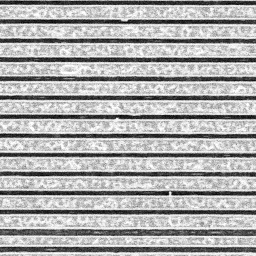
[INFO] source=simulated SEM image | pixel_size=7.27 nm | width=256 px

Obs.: parallel lines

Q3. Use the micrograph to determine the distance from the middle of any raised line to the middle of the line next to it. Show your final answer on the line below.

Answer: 139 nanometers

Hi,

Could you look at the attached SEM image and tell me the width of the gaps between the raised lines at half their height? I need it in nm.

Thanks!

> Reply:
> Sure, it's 39.1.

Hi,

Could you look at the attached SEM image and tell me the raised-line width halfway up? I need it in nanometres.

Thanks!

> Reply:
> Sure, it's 98.1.